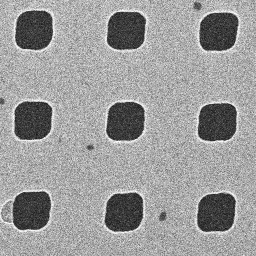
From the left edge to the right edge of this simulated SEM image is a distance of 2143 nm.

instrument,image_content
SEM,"a regular array of holes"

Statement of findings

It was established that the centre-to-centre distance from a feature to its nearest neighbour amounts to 0.755 micrometres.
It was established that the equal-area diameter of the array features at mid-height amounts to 344 nm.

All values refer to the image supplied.